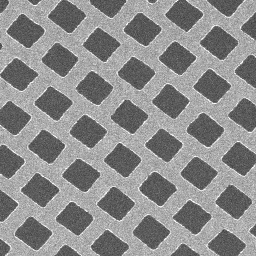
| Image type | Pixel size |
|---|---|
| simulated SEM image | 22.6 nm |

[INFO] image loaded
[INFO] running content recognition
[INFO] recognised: a regular array of holes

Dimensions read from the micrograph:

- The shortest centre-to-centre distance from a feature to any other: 991 nm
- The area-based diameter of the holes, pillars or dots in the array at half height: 710 nanometres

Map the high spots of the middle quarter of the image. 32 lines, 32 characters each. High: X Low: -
---XXXXXXXXXXXX------XXXX------X
--XXXXXXXXXXXX--------XXXXX----X
-XXXXX--XXXXX----------XXXXX--XX
XXXXX-----XXXX--------XXXXXXXXXX
XXXX-------XXXX------XXXXXXXXXXX
XXX---------XXXXX---XXXXX--XXXXX
XXX---------XXXXXXXXXXXX----XXXX
XXXX--------XXXXXXXXXXX-------XX
-XXXX------XXXXXXXXXXX---------X
--XXXXX---XXXXX--XXXXX---------X
--XXXXXXXXXXXX----XXXXX--------X
-XXXXXXXXXXXX-------XXXX------XX
XXXXXXXXXXXX---------XXXX----XXX
XXXX---XXXXX---------XXXXXX-XXXX
XXX-----XXXX--------XXXXXXXXXXXX
XX--------XXXX-----XXXXXXXXXXXX-
XX---------XXXX---XXXXXX-XXXXXX-
X----------XXXXXXXXXXXX----XXXX-
XX--------XXXXXXXXXXXX------XXXX
XXXX-----XXXXXXXXXXXX--------XXX
XXXXX---XXXXX--XXXXX----------XX
XXXXXXXXXXXX-----XXXX--------XXX
XXXXXXXXXXX-------XXXXX-----XXXX
XXXXXXXXXX---------XXXXX---XXXXX
XX---XXXXX---------XXXXXX-XXXXX-
X------XXXX--------XXXXXXXXXXX--
--------XXXXX-----XXXXXXXXXXXX--
---------XXXXX---XXXXX--XXXXX---
---------XXXXXXXXXXXX----XXXXX--
X-------XXXXXXXXXXXX-------XXXX-
XX-----XXXXXXXXXXXX---------XXXX
XXXX--XXXXX---XXXXX---------XXXX